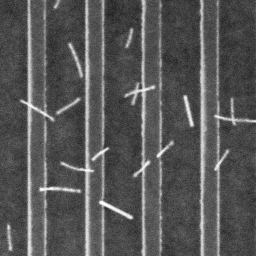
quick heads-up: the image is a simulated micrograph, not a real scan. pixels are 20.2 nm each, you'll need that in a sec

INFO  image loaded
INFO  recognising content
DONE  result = lines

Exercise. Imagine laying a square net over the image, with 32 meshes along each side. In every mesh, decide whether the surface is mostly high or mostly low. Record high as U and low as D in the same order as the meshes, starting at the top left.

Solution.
DDDDUUDDDDDUUDDDDDUUDDDDDUUDDDDD
DDDDUUDDDDDUUDDDDDUUDDDDDUUDDDDD
DDDDUUDDDDDUUDDDDDUUDDDDDUUDDDDD
DDDDUUDDDDDUUDDDDDUUDDDDDUUDDDDD
DDDDUUDDDDDUUDDDDDUUDDDDDUUDDDDD
DDDDUUDDDDDUUDDDDDUUDDDDDUUDDDDD
DDDDUUDDDDDUUDDDDDUUDDDDDUUDDDDD
DDDDUUDDDDDUUDDDDDUUDDDDDUUDDDDD
DDDDUUDDDDDUUDDDDDUUDDDDDUUDDDDD
DDDDUUDDDDDUUDDDDDUUDDDDDUUDDDDD
DDDDUUDDDDDUUDDDDDUUDDDDDUUDDDDD
DDDDUUDDDDDUUDDDDDUUDDDDDUUDDDDD
DDDUUUDDDDDUUDDDDDUUDDDDDUUDDDDD
DDDUUUDDDDDUUDDDDDUUDDDDDUUDDDDD
DDDDUUDDDDDUUDDDDDUUDDDDDUUDDDDD
DDDDUUDDDDDUUDDDDDUUDDDDDUUDDDDD
DDDDUUDDDDDUUDDDDDUUDDDDDUUDDDDD
DDDDUUDDDDDUUDDDDDUUDDDDDUUDDDDD
DDDDUUDDDDDUUDDDDDUUDDDDDUUDDDDD
DDDDUUDDDDDUUDDDDDUUDDDDDUUDDDDD
DDDDUUDDDDDUUDDDDDUUDDDDDUUDDDDD
DDDDUUDDDDDUUDDDDDUUDDDDDUUDDDDD
DDDDUUDDDDDUUDDDDDUUDDDDDUUDDDDD
DDDDUUDDDDDUUDDDDDUUDDDDDUUDDDDD
DDDDUUDDDDDUUDDDDDUUDDDDDUUDDDDD
DDDDUUDDDDDUUDDDDDUUDDDDDUUDDDDD
DDDDUUDDDDDUUDDDDDUUDDDDDUUDDDDD
DDDDUUDDDDDUUDDDDDUUDDDDDUUDDDDD
DDDDUUDDDDDUUDDDDDUUDDDDDUUDDDDD
DDDDUUDDDDDUUDDDDDUUDDDDDUUDDDDD
DDDDUUDDDDDUUDDDDDUUDDDDDUUDDDDD
DDDDUUDDDDDUUDDDDDUUDDDDDUUDDDDD